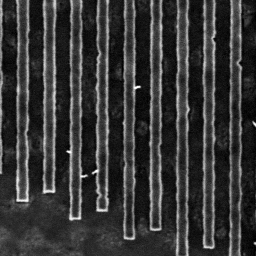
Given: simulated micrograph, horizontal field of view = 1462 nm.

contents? parallel lines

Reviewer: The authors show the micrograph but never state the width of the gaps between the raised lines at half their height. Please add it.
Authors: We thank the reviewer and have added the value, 90.6 nanometers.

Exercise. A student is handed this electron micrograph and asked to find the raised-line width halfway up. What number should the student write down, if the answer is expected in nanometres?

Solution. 58.5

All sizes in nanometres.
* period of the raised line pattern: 152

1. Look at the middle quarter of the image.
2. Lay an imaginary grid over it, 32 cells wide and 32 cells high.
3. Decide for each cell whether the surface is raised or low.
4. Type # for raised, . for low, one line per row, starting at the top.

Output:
..##....###....###....##.....##.
..##....###....###....##.....##.
..##....###....###....##....###.
..##....###....###....##....###.
..##....###....###....##....###.
..##....###....###....##....###.
..##....###....###....##....###.
..##....###....###....##....###.
..##....###....###....##....###.
..##....###....###....##....###.
..##....###....###....##....###.
..##....###....###....##....###.
..##....###....###....##.....##.
..##....###....###....##....###.
..##....###....###....##....###.
..##....###....##.....##....###.
..##....###....##.....##....###.
..##....###....##.....##.....##.
..##....###....###....##.....##.
..##....###....###....##.....##.
..##....###....###....##.....##.
.###....###....###....##....###.
.###....###....##.....##....###.
..##....###....###....##....###.
..##....###....###....##....###.
..##....###....###....##....###.
..##....###....###....##....###.
..##....###....###....##....###.
..##....###....###....##....###.
..##....###....###....##....###.
.###....###....###....##....###.
..##....###....##.....##.....##.